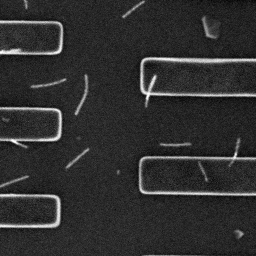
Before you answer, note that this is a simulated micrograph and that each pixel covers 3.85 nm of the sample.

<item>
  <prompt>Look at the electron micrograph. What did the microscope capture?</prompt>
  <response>groups of lines, slits or small figures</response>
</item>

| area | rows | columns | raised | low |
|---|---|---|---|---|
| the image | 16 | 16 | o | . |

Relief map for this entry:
................
oooo............
oooo............
................
.........ooooooo
.........ooooooo
................
oooo............
oooo............
................
.........ooooooo
.........ooooooo
oooo............
oooo............
................
................